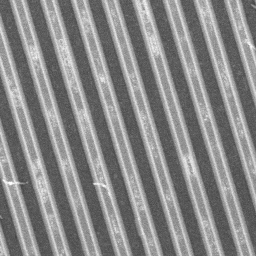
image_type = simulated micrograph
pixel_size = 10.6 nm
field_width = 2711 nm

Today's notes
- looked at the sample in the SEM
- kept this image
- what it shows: parallel lines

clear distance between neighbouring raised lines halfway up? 179 nm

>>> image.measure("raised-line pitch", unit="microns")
0.311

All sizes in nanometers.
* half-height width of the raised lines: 131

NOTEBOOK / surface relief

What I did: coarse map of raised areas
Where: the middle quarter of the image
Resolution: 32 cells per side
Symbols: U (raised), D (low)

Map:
UUUDDDDUUUDDDDDUUUDDDDUUUUDDDDUU
UUUDDDDUUUDDDDDUUUDDDDDUUUDDDDUU
UUUDDDDDUUUDDDDUUUUDDDDUUUDDDDDU
UUUDDDDDUUUDDDDDUUUDDDDUUUUDDDDU
DUUUDDDDUUUDDDDDUUUDDDDDUUUDDDDU
DUUUDDDDDUUUDDDDUUUDDDDDUUUDDDDD
DUUUDDDDDUUUDDDDDUUUDDDDUUUDDDDD
DUUUUDDDDUUUDDDDDUUUDDDDUUUUDDDD
DDUUUDDDDDUUUDDDDUUUDDDDDUUUDDDD
DDUUUDDDDDUUUDDDDUUUUDDDDUUUDDDD
DDUUUDDDDDUUUDDDDDUUUDDDDUUUUDDD
DDDUUUDDDDUUUUDDDDUUUDDDDDUUUDDD
DDDUUUDDDDDUUUDDDDUUUUDDDDUUUDDD
DDDUUUDDDDDUUUDDDDDUUUDDDDUUUDDD
DDDUUUUDDDDUUUDDDDDUUUDDDDDUUUDD
DDDDUUUDDDDDUUUDDDDUUUDDDDDUUUDD
DDDDUUUDDDDDUUUDDDDDUUUDDDDUUUDD
DDDDUUUUDDDDUUUDDDDDUUUDDDDUUUUD
DDDDDUUUDDDDUUUDDDDDUUUDDDDDUUUD
UDDDDUUUDDDDDUUUDDDDUUUUDDDDUUUD
UDDDDUUUDDDDDUUUDDDDDUUUDDDDUUUU
UDDDDDUUUDDDDUUUDDDDDUUUDDDDDUUU
UDDDDDUUUDDDDDUUUDDDDUUUDDDDDUUU
UUDDDDUUUDDDDDUUUDDDDDUUUDDDDUUU
UUDDDDUUUUDDDDUUUDDDDDUUUDDDDDUU
UUDDDDDUUUDDDDDUUUDDDDUUUDDDDDUU
UUUDDDDUUUDDDDDUUUDDDDUUUUDDDDUU
UUUDDDDUUUUDDDDUUUDDDDDUUUDDDDUU
UUUDDDDDUUUDDDDUUUDDDDDUUUDDDDDU
UUUDDDDDUUUDDDDDUUUDDDDUUUUDDDDU
DUUUDDDDUUUDDDDDUUUDDDDDUUUDDDDU
DUUUDDDDUUUUDDDDUUUDDDDDUUUDDDDD